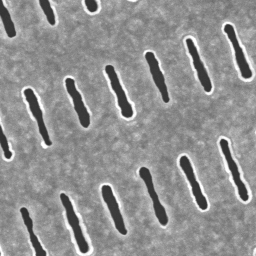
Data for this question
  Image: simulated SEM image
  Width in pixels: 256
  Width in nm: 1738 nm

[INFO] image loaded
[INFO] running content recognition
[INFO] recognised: a regular array of holes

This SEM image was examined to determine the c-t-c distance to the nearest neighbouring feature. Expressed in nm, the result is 284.